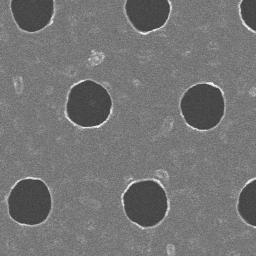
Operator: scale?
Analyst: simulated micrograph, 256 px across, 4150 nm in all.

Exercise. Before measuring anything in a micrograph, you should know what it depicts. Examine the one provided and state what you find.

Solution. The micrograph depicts holes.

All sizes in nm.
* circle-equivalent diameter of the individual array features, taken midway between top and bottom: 734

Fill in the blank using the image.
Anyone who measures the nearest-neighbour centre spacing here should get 1840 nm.